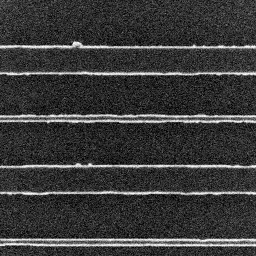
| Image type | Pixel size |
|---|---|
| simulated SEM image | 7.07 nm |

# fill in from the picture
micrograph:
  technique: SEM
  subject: lines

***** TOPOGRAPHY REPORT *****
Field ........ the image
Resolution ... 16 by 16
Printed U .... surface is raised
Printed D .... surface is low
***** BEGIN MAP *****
DDDDDDDDDDDDDDDD
DDDDDDDDDDDDDDDD
DDDDDDDDDDDDDDDD
UUUUUUUUUUUUUUUU
UUUUUUUUUUUUUUUU
DDDDDDDDDDDDDDDD
DDDDDDDDDDDDDDDD
DDDDDDDDDDDDDDDD
DDDDDDDDDDDDDDDD
DDDDDDDDDDDDDDDD
UUUUUUUUUUUUUUUU
UUUUUUUUUUUUUUUU
DDDDDDDDDDDDDDDD
DDDDDDDDDDDDDDDD
DDDDDDDDDDDDDDDD
DDDDDDDDDDDDDDDD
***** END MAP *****